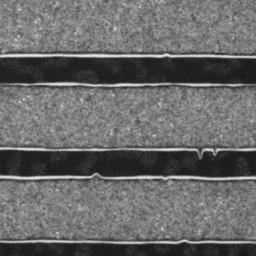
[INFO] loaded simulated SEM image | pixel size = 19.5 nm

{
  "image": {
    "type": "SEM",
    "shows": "one or a few lines or trenches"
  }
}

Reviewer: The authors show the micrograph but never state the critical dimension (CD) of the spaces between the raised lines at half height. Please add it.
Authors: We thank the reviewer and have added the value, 1260 nm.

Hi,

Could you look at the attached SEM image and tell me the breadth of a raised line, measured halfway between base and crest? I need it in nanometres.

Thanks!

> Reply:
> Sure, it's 558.